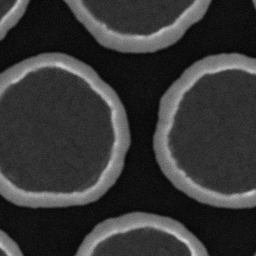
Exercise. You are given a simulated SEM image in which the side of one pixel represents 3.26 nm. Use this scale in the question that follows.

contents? raised bodies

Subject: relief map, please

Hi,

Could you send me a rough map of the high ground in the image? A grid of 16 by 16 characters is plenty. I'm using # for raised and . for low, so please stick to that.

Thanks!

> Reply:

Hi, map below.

#....########...
#.....######....
.......###......
................
.####.......####
######.....#####
#######....#####
########..######
########..######
########..######
#######....#####
#######....#####
..###........###
................
......#####.....
#....#######....